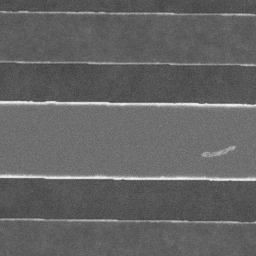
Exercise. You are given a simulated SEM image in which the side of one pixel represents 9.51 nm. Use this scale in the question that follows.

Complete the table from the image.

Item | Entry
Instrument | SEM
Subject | lines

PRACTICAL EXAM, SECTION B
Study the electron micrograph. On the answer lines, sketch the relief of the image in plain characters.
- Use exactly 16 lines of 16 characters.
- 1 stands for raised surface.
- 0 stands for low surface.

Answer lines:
0000000000000000
1111111111111111
1111111111111111
1111111111111111
0000000000000000
0000000000000000
1111111111111000
1111111111111111
1111111111111111
1111111111111111
1111111111111111
0000000000000000
0000000000000000
0000000000000000
1111111111111111
1111111111111111